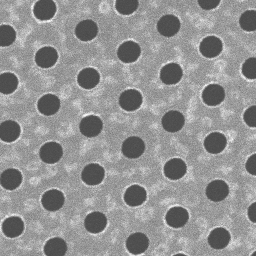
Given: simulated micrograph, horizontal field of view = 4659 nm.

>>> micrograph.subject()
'a regular array of holes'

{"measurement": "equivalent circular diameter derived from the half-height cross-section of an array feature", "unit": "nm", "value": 426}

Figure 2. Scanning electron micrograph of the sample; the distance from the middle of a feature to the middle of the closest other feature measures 860 nanometers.